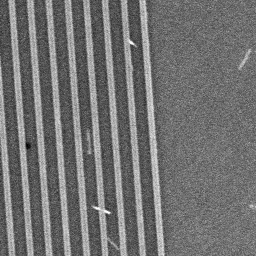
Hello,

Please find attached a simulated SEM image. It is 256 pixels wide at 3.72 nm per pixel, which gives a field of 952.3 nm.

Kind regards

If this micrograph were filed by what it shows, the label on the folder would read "parallel lines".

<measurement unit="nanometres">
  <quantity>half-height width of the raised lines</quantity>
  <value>21.3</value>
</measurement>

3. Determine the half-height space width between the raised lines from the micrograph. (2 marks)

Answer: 46.8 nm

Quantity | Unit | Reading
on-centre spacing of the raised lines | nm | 69.2